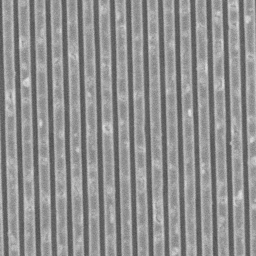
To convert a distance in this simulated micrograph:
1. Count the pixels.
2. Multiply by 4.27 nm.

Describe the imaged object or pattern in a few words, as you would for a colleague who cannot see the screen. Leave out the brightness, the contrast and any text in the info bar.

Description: parallel lines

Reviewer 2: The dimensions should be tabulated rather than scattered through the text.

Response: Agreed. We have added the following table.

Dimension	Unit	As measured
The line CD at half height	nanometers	46.9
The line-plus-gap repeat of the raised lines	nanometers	68.8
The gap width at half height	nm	21.9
